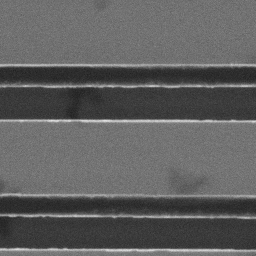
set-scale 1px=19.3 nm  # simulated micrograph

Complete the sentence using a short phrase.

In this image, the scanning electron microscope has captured lines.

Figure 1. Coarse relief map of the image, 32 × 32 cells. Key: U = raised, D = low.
UUUUUUUUUUUUUUUUUUUUUUUUUUUUUUUU
UUUUUUUUUUUUUUUUUUUUUUUUUUUUUUUU
UUUUUUUUUUUUUUUUUUUUUUUUUUUUUUUU
UUUUUUUUUUUUUUUUUUUUUUUUUUUUUUUU
UUUUUUUUUUUUUUUUUUUUUUUUUUUUUUUU
UUUUUUUUUUUUUUUUUUUUUUUUUUUUUUUU
UUUUUUUUUUUUUUUUUUUUUUUUUUUUUUUU
UUUUUUUUUUUUUUUUUUUUUUUUUUUUUUUU
UUUUUUUUUUUUUUUUUUUUUUUUUUUUUUUU
UUUUUUUUUUUUUUUUUUUUUUUUUUUUUUUU
UUUUUUUUUUUUUUUUUUUUUUUUUUUUUUUU
DDDDDDDDDDDDDDDDDDDDDDDDDDDDDDDD
DDDDDDDDDDDDDDDDDDDDDDDDDDDDDDDD
DDDDDDDDDDDDDDDDDDDDDDDDDDDDDDDD
DDDDDDDDDDDDDDDDDDDDDDDDDDDDDDDD
UUUUUUUUUUUUUUUUUUUUUUUUUUUUUUUU
UUUUUUUUUUUUUUUUUUUUUUUUUUUUUUUU
UUUUUUUUUUUUUUUUUUUUUUUUUUUUUUUU
UUUUUUUUUUUUUUUUUUUUUUUUUUUUUUUU
UUUUUUUUUUUUUUUUUUUUUUUUUUUUUUUU
UUUUUUUUUUUUUUUUUUUUUUUUUUUUUUUU
UUUUUUUUUUUUUUUUUUUUUUUUUUUUUUUU
UUUUUUUUUUUUUUUUUUUUUUUUUUUUUUUU
UUUUUUUUUUUUUUUUUUUUUUUUUUUUUUUU
UUUUUUUUUUUUUUUUUUUUUUUUUUUUUUUU
UUUUUUUUUUUUUUUUUUUUUUUUUUUUUUUU
UUUUUUUUUUUUUUUUUUUUUUUUUUUUUUUU
DDDDDDDDDDDDDDDDDDDDDDDDDDDDDDDD
DDDDDDDDDDDDDDDDDDDDDDDDDDDDDDDD
DDDDDDDDDDDDDDDDDDDDDDDDDDDDDDDD
DDDDDDDDDDDDDDDDDDDDDDDDDDDDDDDD
UUUUUUUUUUUUUUUUUUUUUUUUUUUUUUUU